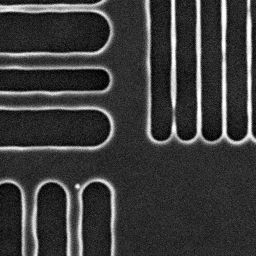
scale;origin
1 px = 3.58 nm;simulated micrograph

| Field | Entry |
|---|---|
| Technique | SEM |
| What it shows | groups of lines, slits or small figures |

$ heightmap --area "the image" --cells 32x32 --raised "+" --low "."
............++++++..............
...++.......+++++++.............
.............++++++.............
..............+++++.............
..............+++++.............
.............++++++.............
............+++++++.............
+++++++++++++++++++.............
+++++++++++++++++++.............
..............+++++.............
..............+++++..+..........
....++..+++++++++++..+..........
+++++++++++++++++++.............
+++++++++++++++++++.............
.............++++++.............
..............+++++.............
..............+++++..+..........
.............++++++..++.++.++.++
.+.+++++++++++++++++++++++++++++
++++++++++++++++++++++++++++++++
++++++++++++++++++++++++++++++++
++++++++++++++++++++++++++++++++
++++++++++++++++++++++++++++++++
..+++...+++...++++++++++++++++++
...++...++....++++++++++++++++++
...+.....+....++++++++++++++++++
...+....++....++++++++++++++++++
...+....++....++++++++++++++++++
...+....++....++++++++++++++++++
...+.....+....++++++++++++++++++
...++....+....++++++++++++++++++
...++....+....++++++++++++++++++